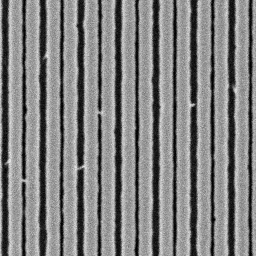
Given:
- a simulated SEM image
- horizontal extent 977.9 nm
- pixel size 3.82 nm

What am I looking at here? parallel lines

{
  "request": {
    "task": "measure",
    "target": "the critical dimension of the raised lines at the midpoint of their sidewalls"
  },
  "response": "0.0525 um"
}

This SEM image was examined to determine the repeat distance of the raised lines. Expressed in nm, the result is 72.1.